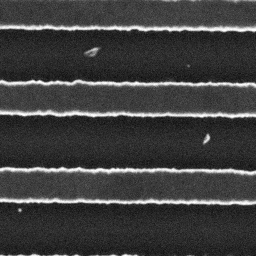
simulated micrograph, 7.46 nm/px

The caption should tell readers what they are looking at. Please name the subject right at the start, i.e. lines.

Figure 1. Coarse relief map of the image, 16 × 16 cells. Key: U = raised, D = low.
UUUUUUUUUUUUUUUU
UUUUUUUUUUUUUUUU
DDDDDDDDDDDDDDDD
DDDDDDDDDDDDDDDD
DDDDDDDDDDDDDDDD
UUUUUUUUUUUUUUUU
UUUUUUUUUUUUUUUU
DDDDDDDDDDDDDDDD
DDDDDDDDDDDDDDDD
DDDDDDDDDDDDDDDD
DDDDDDDDDDDDDDDD
UUUUUUUUUUUUUUUU
UUUUUUUUUUUUUUUU
DDDDDDDDDDDDDDDD
DDDDDDDDDDDDDDDD
DDDDDDDDDDDDDDDD